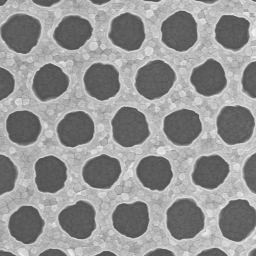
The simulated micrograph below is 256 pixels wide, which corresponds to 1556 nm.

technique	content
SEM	a regular array of holes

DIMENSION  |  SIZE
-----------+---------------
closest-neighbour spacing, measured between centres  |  317 nm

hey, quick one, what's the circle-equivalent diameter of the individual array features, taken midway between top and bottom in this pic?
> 36.4 px